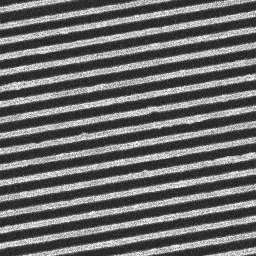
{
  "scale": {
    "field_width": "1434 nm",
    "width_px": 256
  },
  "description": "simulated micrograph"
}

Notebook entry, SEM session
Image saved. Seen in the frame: parallel lines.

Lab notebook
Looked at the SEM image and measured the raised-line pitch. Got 86.8 nanometres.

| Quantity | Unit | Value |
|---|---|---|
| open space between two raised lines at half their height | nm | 48.3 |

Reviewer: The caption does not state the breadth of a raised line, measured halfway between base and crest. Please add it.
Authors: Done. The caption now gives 38 nanometers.